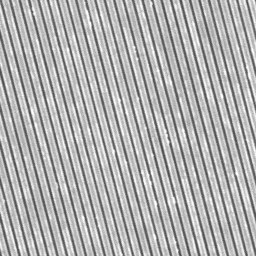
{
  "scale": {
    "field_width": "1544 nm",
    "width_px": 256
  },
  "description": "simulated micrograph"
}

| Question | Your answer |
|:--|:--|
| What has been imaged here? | parallel lines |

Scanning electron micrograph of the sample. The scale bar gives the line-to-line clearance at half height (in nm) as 21.8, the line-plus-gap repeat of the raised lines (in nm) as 55.2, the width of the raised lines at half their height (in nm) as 33.5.